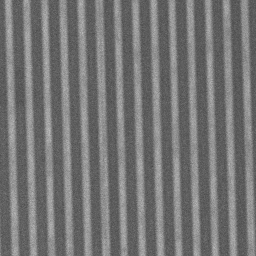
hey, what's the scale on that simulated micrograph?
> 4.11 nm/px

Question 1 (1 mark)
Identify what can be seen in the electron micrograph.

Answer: parallel lines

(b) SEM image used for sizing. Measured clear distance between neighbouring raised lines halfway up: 12 pixels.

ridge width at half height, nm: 26.2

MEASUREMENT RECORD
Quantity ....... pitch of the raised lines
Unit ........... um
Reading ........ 0.0747